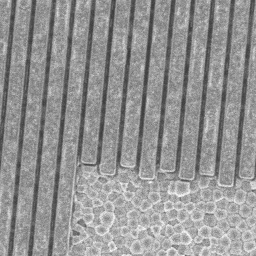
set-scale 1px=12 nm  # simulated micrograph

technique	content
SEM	parallel lines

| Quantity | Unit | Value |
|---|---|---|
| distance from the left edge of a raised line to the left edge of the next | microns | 0.237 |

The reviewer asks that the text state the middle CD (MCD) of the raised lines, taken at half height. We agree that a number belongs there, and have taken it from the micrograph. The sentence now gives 174 nm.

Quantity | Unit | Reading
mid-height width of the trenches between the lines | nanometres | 61